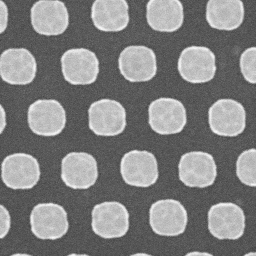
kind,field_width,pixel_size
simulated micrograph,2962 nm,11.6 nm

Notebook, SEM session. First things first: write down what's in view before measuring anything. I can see a regular array of raised bodies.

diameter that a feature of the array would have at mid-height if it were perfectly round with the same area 424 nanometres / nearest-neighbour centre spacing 57.9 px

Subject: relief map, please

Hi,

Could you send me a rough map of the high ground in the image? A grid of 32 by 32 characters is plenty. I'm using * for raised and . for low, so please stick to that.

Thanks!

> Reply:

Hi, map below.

*...****....****...***....****..
*...****....****..*****...****..
*...****....****..*****...****..
*...****....***....***.....**...
................................
................................
.***.....**....****....***.....*
****....****...****...*****...**
****....****...****...*****...**
****....****....***....****....*
................................
................................
....................**......*...
....****...****....****...****..
*...****...*****...****...*****.
*...****...*****...****...*****.
....***.....***.....**.....***..
................................
................................
.**.....***.....***....***....**
*****...****...*****...****...**
*****...****...*****..*****...**
*****...****....***....****...**
................................
................................
.............**....***..........
*...****....****...****...****..
*...****....****...****...****..
*...****....****...****...****..
.....***.....**............***..
................................
................................